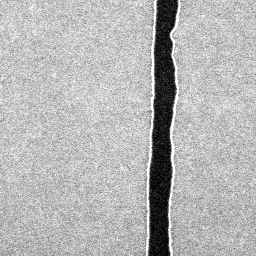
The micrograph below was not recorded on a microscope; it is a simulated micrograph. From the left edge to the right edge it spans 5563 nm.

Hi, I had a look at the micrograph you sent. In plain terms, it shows one or a few lines or trenches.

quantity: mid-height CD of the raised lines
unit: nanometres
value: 506